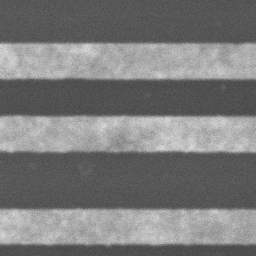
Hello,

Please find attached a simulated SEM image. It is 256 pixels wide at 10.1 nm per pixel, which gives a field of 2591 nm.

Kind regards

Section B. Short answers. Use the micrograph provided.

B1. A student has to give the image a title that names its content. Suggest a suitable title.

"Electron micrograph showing lines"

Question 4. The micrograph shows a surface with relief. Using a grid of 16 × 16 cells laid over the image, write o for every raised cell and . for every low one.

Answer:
................
................
................
oooooooooooooooo
oooooooooooooooo
................
................
oooooooooooooooo
oooooooooooooooo
................
................
................
................
oooooooooooooooo
oooooooooooooooo
................